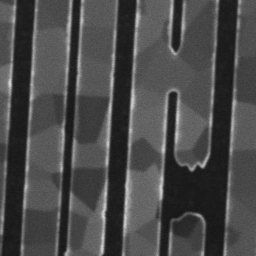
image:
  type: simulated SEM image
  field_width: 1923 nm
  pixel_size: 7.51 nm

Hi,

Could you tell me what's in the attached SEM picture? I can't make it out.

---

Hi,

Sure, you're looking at parallel lines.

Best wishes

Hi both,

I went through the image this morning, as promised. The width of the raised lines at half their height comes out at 0.27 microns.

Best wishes